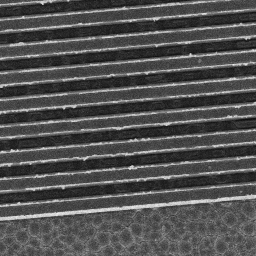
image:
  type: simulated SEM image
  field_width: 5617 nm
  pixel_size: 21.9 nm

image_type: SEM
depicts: parallel lines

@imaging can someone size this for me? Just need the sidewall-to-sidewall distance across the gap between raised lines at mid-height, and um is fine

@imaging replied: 0.265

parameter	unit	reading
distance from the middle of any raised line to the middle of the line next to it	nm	582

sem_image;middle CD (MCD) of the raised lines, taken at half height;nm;320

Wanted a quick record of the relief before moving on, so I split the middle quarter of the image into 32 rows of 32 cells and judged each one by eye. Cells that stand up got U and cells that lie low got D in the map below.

DDDUUUUUUUUUUUUUUUUUUUUUUUUUUUUU
UUUUUUUUUUUUUUUUUUUUUUUUUUUUUDDD
UUUUUUUUUUUUUUUUUUDDDDDDDDDDDDDD
UUUUUUDDDDDDDDDDDDDDDDDDDDDDDDDD
DDDDDDDDDDDDDDDDDDDDDDDDDDDDDDDD
DDDDDDDDDDDDDDDDDDDDDUUUUUUUUUUU
DDDDDDDDDUUUUUUUUUUUUUUUUUUUUUUU
UUUUUUUUUUUUUUUUUUUUUUUUUUUUUUUU
UUUUUUUUUUUUUUUUUUUUUUUUUDDDDDDD
UUUUUUUUUUUUUUDDDDDDDDDDDDDDDDDD
UUUDDDDDDDDDDDDDDDDDDDDDDDDDDDDD
DDDDDDDDDDDDDDDDDDDDDDDDDDDDUUUU
DDDDDDDDDDDDDDDDUUUUUUUUUUUUUUUU
DDDDDUUUUUUUUUUUUUUUUUUUUUUUUUUU
UUUUUUUUUUUUUUUUUUUUUUUUUUUUUUUD
UUUUUUUUUUUUUUUUUUUUUDDDDDDDDDDD
UUUUUUUUUUDDDDDDDDDDDDDDDDDDDDDD
DDDDDDDDDDDDDDDDDDDDDDDDDDDDDDDD
DDDDDDDDDDDDDDDDDDDDDDDDUUUUUUUU
DDDDDDDDDDDDDUUUUUUUUUUUUUUUUUUU
DDUUUUUUUUUUUUUUUUUUUUUUUUUUUUUU
UUUUUUUUUUUUUUUUUUUUUUUUUUUUUUDD
UUUUUUUUUUUUUUUUUUDDDDDDDDDDDDDD
UUUUUUUDDDDDDDDDDDDDDDDDDDDDDDDD
DDDDDDDDDDDDDDDDDDDDDDDDDDDDDDUU
DDDDDDDDDDDDDDDDDDDDDUUUUUUUUUUU
DDDDDDDDUUUUUUUUUUUUUUUUUUUUUUUU
UUUUUUUUUUUUUUUUUUUUUUUUUUUUUUUU
UUUUUUUUUUUUUUUUUUUUUUUUUUUDDDDD
UUUUUUUUUUUUUUUDDDDDDDDDDDDDDDDD
UUUDDDDDDDDDDDDDDDDDDDDDDDDDDDDD
DDDDDDDDDDDDDDDDDDDDDDDDDDDDUUUU